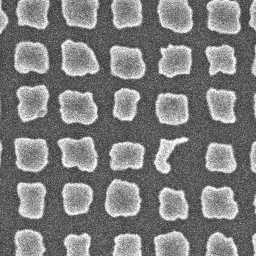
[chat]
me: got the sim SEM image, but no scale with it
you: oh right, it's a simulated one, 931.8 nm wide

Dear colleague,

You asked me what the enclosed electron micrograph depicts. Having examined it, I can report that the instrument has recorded a regular array of raised bodies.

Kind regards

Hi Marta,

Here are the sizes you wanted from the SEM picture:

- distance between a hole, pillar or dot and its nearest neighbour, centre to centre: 164 nanometers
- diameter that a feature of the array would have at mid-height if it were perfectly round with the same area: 119 nm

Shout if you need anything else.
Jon